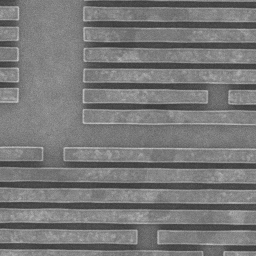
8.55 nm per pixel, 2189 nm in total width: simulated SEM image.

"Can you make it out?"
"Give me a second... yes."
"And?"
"groups of lines, slits or small figures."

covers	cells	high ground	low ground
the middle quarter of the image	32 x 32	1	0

00000000000000000000000000000000
00000111111111111111111111111111
00000111111111111111111111111111
00000111111111111111111111111111
00000000000000000000111111111111
00000000000000000000000000000000
00000111111111111111111111110000
00000111111111111111111111111111
00000111111111111111111111111111
00000111111111111111111111111111
00000000000000000000000000000000
00000000000000000000000000000000
00000111111111111111111111111111
00000111111111111111111111111111
00000111111111111111111111111111
00000000000000000000000000000000
00000000000000000000000000000000
00000000000000000000000000000000
00000000000000000000000000000000
00000000000000000000000000000000
00000000000000000000000000000000
11111111111111111111111111111111
11111111111111111111111111111111
11111111111111111111111111111111
00000000000000000000000000000000
00000000000000000000000000000000
11111111111111111111111111111111
11111111111111111111111111111111
11111111111111111111111111111111
00000000000000000000000000000000
00000000000000000000000000000000
11111111111111111111111111111000